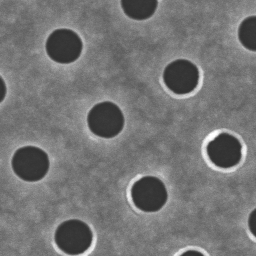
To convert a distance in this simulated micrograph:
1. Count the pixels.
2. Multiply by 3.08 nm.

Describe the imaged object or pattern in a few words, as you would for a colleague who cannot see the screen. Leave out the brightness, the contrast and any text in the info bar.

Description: holes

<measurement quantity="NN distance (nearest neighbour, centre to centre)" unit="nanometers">263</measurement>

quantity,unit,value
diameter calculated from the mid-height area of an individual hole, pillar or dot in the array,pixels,35.7